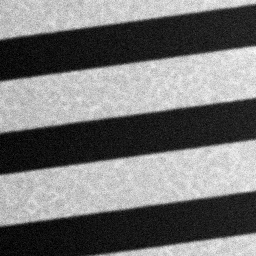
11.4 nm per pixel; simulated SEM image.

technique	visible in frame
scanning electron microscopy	one or a few lines or trenches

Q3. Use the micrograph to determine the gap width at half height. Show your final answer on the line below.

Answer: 42.7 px